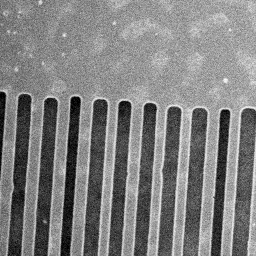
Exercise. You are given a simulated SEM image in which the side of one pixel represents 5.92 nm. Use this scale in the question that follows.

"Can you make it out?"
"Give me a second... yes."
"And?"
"parallel lines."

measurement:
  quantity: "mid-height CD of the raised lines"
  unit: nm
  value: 70.1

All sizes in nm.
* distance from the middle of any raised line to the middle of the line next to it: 147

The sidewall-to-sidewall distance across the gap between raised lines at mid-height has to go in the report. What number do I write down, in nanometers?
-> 80.4